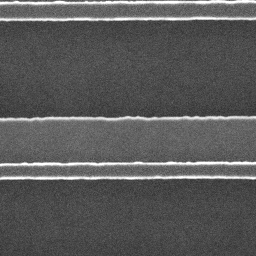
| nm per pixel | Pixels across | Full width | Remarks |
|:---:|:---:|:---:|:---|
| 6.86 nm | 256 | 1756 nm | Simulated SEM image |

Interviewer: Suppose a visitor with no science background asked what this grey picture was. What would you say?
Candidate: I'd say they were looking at lines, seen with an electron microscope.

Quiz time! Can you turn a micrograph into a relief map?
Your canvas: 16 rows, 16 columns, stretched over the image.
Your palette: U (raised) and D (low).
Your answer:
UUUUUUUUUUUUUUUU
DDDDDDDDDDDDDDDD
DDDDDDDDDDDDDDDD
DDDDDDDDDDDDDDDD
DDDDDDDDDDDDDDDD
DDDDDDDDDDDDDDDD
DDDDDDDDDDDDDDDD
UUUUUUUUUUUUUUUU
UUUUUUUUUUUUUUUU
UUUUUUUUUUUUUUUU
UUUUUUUUUUUUUUUU
DDDDDDDDDDDDDDDD
DDDDDDDDDDDDDDDD
DDDDDDDDDDDDDDDD
DDDDDDDDDDDDDDDD
DDDDDDDDDDDDDDDD